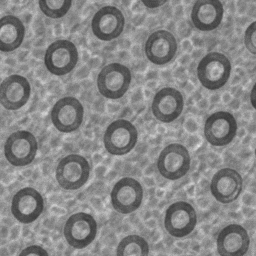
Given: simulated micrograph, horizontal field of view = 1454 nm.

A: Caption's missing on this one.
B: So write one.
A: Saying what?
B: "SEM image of a regular array of ring-shaped grooves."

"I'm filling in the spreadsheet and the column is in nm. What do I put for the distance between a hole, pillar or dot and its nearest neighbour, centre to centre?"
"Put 325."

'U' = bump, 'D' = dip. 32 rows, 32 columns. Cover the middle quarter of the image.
DDDUUUUUUUDDDDDDUUUUUUUUUUUUUUUU
DDUUUUUUUDDDDDDDDUUUUUUUUUUUUUUU
DUUUUUUUUDDUUUDDDUUUUUUUUUUUUUUU
UUUUUUUUDDDUUUUDDUUUUUUUUUUUUUUU
UUUUUUUUDDDUUUUDDUUUUUUUUUUUUUUU
UUUUUUUUDDDUUUDDUUUUUUUUUUUUUUUU
UUUUUUUUDDDDUDDDUUUUUUUUDDDDDUUU
UUUUUUUUUDDDDDDUUUUUUUUDDDDDDDUU
DDDUUUUUUUDDDDUUUUUUUUDDDUUDDDUU
DDDDUUUUUUUUUUUUUUUUUUDDUUUUDDUU
DDDDDUUUUUUUUUUUUUUUUUDDUUUUDDUU
UUUDDUUUUUUUUUUUUUUUUUDDUUUUDDUU
UUUDDUUUUUUUUUUUUUUUUUDDDDDDDUUU
UUUDDUUUUUUUUUUUUUUUUUUDDDDDUUUU
UUDDDUUUUUUUDDDDDUUUUUUUDDDUUUUU
DDDDUUUUUUUDDDDDDDUUUUUUUUUUUUUU
DDDUUUUUUUDDDUUDDDUUUUUUUUUUUUUU
UUUUUUUUUUDDUUUUDDDUUUUUUUUUUUUU
UUUUUUUUUUDDUUUUDDUUUUUUUUUUUUUU
UUUUUUUUUUDDUUUUDDUUUUUUUUUUUUUU
UUUUUUUUUUDDDUUDDDUUUUUUUDDDDDUU
UUUUUUUUUUDDDDDDDUUUUUUUDDDDDDDU
UUDUUUUUUUUUDDDDUUUUUUUUDDUUDDDU
DDDDDUUUUUUUUUUUUUUUUUUUDDUUUDDD
DDDDDDUUUUUUUUUUUUUUUUUDDUUUUUDD
UUUUDDDUUUUUUUUUUUUUUUUDDUUUUDDD
UUUUDDDUUUUUUUUUUUUUUUUUDDUUDDDU
UUUUDDDUUUUUUUUUUUUUUUUUDDDDDDDU
DUUUDDUUUUUUUUDDDUUUUUUUUDDDDUUU
DDDDDDUUUUUUUDDDDDDUUUUUUUUUUUUU
DDDDDUUUUUUUDDDDDDDUUUUUUUUUUUUU
DDDUUUUUUUUUDDUUUDDDUUUUUUUUUUUU